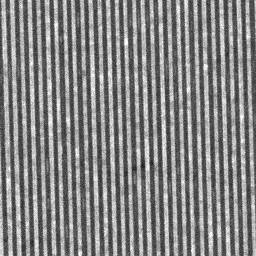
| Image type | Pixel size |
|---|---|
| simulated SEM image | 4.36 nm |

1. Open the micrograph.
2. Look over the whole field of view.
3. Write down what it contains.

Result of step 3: parallel lines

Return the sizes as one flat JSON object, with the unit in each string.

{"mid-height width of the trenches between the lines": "21.8 nm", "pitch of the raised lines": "38 nanometers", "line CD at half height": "14.2 nm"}